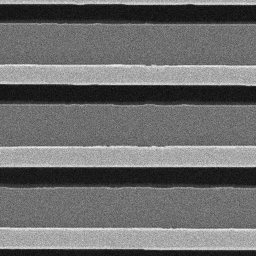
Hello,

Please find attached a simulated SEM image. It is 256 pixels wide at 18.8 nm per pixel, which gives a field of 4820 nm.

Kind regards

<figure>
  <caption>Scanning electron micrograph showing lines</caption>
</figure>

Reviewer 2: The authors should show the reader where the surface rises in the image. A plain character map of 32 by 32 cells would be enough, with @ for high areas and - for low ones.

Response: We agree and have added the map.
---------@@----@@@@@@@@@@@@@@@@@
--------------------------------
--------------------------------
@@@@@@@@@@@@@@@@@@@@@@@@@@@@@@@@
@@@@@@@@@@@@@@@@@@@@@@@@@@@@@@@@
@@@@@@@@@@@@@@@@@@@@@@@@@@@@@@@@
@@@@@@@@@@@@@@@@@@@@@@@@@@@@@@@@
@@@@@@@@@@@@@@@@@@@@@@@@@@@@@@@@
@@@@@@@@@@@@@@@@@@@@@@@@@@@@@@@@
@@@@@@@@@@@@@@@@@@@@@@@@@@@@@@@@
--------@@@@@@@@@@@@@@@@@@@@@@@@
--------------------------------
--------------------------------
@@@@@@@@@@@@@@@@@@@@@@@@@@@@@@@@
@@@@@@@@@@@@@@@@@@@@@@@@@@@@@@@@
@@@@@@@@@@@@@@@@@@@@@@@@@@@@@@@@
@@@@@@@@@@@@@@@@@@@@@@@@@@@@@@@@
@@@@@@@@@@@@@@@@@@@@@@@@@@@@@@@@
@@@@@@@@@@@@@@@@@@@@@@@@@@@@@@@@
@@@@@@@@@@@@@@@@@@@@@@@@@@@@@@@@
@@@@@@@@@@@@@@@@@@@@@@@@@@@@@@@@
--------------------------------
--------------------------------
@@--@@@@@@@@@@@@@@@@-@@@@-@@@@--
@@@@@@@@@@@@@@@@@@@@@@@@@@@@@@@@
@@@@@@@@@@@@@@@@@@@@@@@@@@@@@@@@
@@@@@@@@@@@@@@@@@@@@@@@@@@@@@@@@
@@@@@@@@@@@@@@@@@@@@@@@@@@@@@@@@
@@@@@@@@@@@@@@@@@@@@@@@@@@@@@@@@
@@@@@@@@@@@@@@@@@@@@@@@@@@@@@@@@
@@@@@@@@@@@@@@@@@@@@@@@@@@@@@@@@
--------------------------------